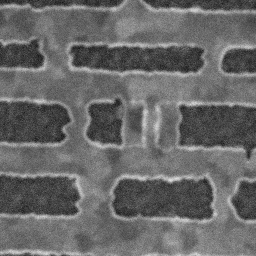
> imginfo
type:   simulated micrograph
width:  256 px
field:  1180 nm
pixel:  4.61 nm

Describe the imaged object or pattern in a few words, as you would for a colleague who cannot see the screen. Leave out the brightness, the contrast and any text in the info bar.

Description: one or a few lines or trenches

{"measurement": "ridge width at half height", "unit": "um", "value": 0.164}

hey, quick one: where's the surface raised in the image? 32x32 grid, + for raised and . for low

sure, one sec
...............+++..............
++++++++++++++++++++++++++++++++
++++++++++++++++++++++++++++++++
++++++++++++++++++++++++++++++++
++++++++++++++++++++++++++++++++
.....+++++++++++++++++++++++++++
.....++++................+++....
......+++................+++....
.....++++................+++....
++++++++++++++++++++++++++++++++
++++++++++++++++++++++++++++++++
++++++++++++++++++++++++++++++++
.+++++++++++++.+++++++++++++++++
........+++....+++++++..........
.........++....++++++++.........
.........++....+++++++..........
........+++....+++++++..........
........+++....+++++++..........
++++++++++++++++++++++++++.+....
++++++++++++++++++++++++++++++++
++++++++++++++++++++++++++++++++
++++++++++++++++++++++++++++++++
..........+++++......+....++++.+
..........++++.............+++..
..........++++.............++...
..........++++.............++...
..........++++.............++...
+++++++++++++++++++++++...++++..
++++++++++++++++++++++++++++++++
++++++++++++++++++++++++++++++++
++++++++++++++++++++++++++++++++
+++.++++++++++++++++++++++++++++